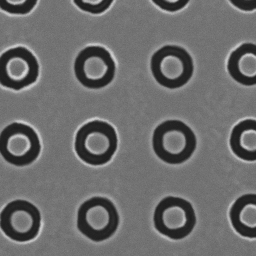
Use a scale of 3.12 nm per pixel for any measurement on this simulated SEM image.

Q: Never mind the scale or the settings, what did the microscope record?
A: ring-shaped grooves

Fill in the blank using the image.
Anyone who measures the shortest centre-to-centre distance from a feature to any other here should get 236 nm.